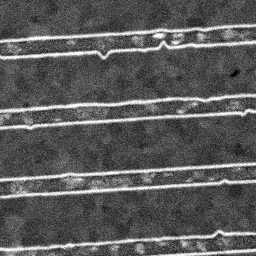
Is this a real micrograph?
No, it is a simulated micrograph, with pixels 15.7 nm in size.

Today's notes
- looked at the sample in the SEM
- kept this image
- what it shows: one or a few lines or trenches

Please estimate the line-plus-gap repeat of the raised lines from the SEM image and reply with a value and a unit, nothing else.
69.1 px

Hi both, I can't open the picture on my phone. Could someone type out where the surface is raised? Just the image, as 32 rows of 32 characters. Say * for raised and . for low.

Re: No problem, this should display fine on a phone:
********************************
********************************
********************************
***************************.....
***********.....................
..............................**
..............******************
********************************
********************************
********************************
********************************
********************************
********************.....*......
*****...........................
........................********
........************************
********************************
********************************
********************************
********************************
*******************************.
***************.................
................................
..................**************
..******************************
********************************
********************************
********************************
********************************
**************************......
***********.....................
............................****